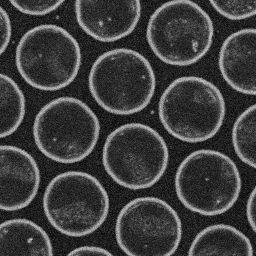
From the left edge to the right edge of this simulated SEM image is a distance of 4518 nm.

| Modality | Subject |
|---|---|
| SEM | a regular array of raised bodies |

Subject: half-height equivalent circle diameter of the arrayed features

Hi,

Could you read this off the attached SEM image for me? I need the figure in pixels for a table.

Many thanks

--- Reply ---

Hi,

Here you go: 61.3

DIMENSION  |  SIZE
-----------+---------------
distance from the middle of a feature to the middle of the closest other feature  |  1300 nm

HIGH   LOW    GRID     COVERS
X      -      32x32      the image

--XXXXX---XXXXXXX----XXX---XXXXX
----X-----XXXXXXX---XXXXX---XXXX
X---------XXXXXXX--XXXXXXX------
X----XX----XXXXX---XXXXXXX------
X--XXXXXX---XXX----XXXXXXX---XXX
X--XXXXXX----------XXXXXXX--XXXX
--XXXXXXXX----XX----XXXXX---XXXX
--XXXXXXXX--XXXXXX---XXX----XXXX
--XXXXXXXX--XXXXXXX---------XXXX
---XXXXXX--XXXXXXXX---------XXXX
XX--XXXX---XXXXXXXX---XXXX---XXX
XX----------XXXXXXX--XXXXXX----X
XXX-----X---XXXXXX--XXXXXXXX----
XXX---XXXXX--XXXX---XXXXXXXX----
XXX--XXXXXXX--------XXXXXXXX--XX
XX---XXXXXXX---------XXXXXX---XX
X----XXXXXXX--XXXXX--XXXXXX--XXX
-----XXXXXXX--XXXXXX---------XXX
X----XXXXXX--XXXXXXXX---------XX
XXX---XXXX---XXXXXXXX---XXXX--XX
XXXX---------XXXXXXXX--XXXXXX--X
XXXXX---------XXXXXX--XXXXXXXX--
XXXXX--XXXXX---XXXX---XXXXXXXX--
XXXX--XXXXXXX---------XXXXXXXX--
XXXX--XXXXXXX----------XXXXXX---
XXX---XXXXXXX---XXXXX--XXXXXX--X
------XXXXXXX--XXXXXXX---XX----X
------XXXXXXX--XXXXXXX---------X
XXXXX--XXXXX---XXXXXXX-----XX---
XXXXXX---------XXXXXXX---XXXXX--
XXXXXX---------XXXXXXX--XXXXXXX-
XXXXXX---XXXX---XXXXX---XXXXXXX-